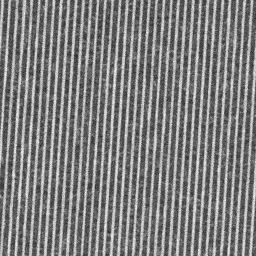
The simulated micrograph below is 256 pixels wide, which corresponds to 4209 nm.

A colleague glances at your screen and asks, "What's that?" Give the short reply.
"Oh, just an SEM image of parallel lines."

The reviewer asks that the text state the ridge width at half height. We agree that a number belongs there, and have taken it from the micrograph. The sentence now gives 0.0308 micrometres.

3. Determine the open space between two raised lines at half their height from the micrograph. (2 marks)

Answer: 90.2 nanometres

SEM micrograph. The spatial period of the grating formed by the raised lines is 120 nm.